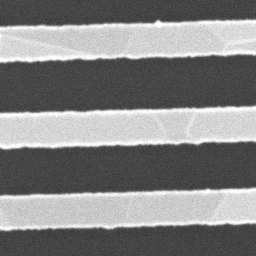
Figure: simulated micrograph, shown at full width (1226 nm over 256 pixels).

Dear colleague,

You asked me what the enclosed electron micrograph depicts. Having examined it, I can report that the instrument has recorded lines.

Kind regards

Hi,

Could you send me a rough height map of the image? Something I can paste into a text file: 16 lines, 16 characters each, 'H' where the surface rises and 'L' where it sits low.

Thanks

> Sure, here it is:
LLLLLLLLLLLLLLLL
LLLLLLLLLHHHHHHH
HHHHHHHHHHHHHHHH
HHHHHHHHHHHHLLLL
LLLLLLLLLLLLLLLL
LLLLLLLLLLLLLLLL
LLLLLLLLLLLLLLLL
HHHHHHHHHHHHHHHH
HHHHHHHHHHHHHHHH
LLLLLLLLLLLLLLLL
LLLLLLLLLLLLLLLL
LLLLLLLLLLLLLLLL
HHHHHHHHHHHHHHHH
HHHHHHHHHHHHHHHH
LLLLLLLLLLLLLLLL
LLLLLLLLLLLLLLLL